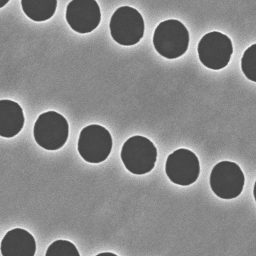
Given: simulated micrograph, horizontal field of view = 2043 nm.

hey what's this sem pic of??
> a regular array of holes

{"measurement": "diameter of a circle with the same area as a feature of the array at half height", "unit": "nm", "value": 295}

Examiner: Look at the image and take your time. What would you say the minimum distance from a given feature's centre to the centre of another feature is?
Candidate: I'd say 362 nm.